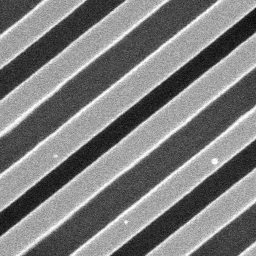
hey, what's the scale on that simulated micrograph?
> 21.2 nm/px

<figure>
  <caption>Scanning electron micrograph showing lines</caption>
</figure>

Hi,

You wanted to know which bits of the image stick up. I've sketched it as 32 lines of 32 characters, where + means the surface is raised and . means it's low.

.....+++++.....+++++.......+++++
....+++++.....+++++.......+++++.
...+++++.....+++++......++++++..
.+++++.....++++++......++++++...
+++++.....+++++.......+++++.....
++++.....+++++.......+++++....++
+++.....+++++......++++++....+++
+.....+++++.......++++++....++++
.....+++++.......+++++.....+++++
....+++++.......+++++....+++++..
...+++++......++++++....+++++...
.+++++.......++++++....+++++....
+++++.......+++++....++++++.....
++++.......+++++....+++++.......
+++......++++++....+++++.......+
++......++++++....+++++......+++
.......+++++....+++++.......++++
......+++++....+++++.......+++++
....++++++....+++++.......++++..
...++++++....+++++......+++++...
..+++++.....+++++......+++++....
.+++++....+++++.......+++++....+
+++++....+++++.......++++.....++
++++....+++++......+++++.....+++
++....++++++......+++++.....++++
+....+++++.......+++++....+++++.
....+++++.......++++.....+++++..
...+++++......+++++.....+++++...
.++++++......+++++.....+++++....
+++++.......+++++....+++++......
++++.......+++++....+++++.......
+++......+++++.....+++++......++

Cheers